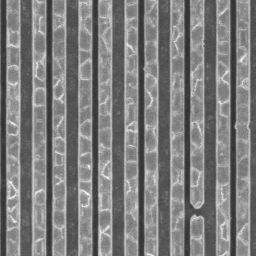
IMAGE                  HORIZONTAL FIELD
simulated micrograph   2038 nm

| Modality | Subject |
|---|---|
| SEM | parallel lines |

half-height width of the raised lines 110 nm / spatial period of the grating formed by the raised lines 183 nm